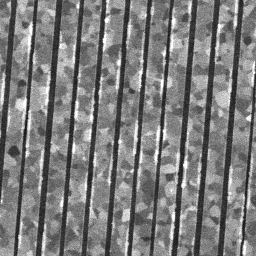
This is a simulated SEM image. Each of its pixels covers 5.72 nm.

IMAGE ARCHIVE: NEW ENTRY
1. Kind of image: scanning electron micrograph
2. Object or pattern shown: parallel lines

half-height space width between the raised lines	0.0306	um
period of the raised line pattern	129	nm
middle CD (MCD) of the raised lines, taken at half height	101	nm